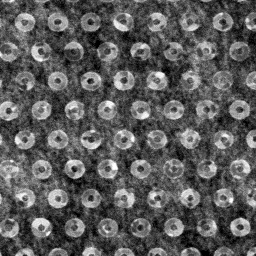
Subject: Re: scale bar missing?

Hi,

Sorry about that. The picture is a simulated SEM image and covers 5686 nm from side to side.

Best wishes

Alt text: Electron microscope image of a regular array of ring-shaped raised bodies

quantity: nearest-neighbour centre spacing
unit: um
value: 0.729